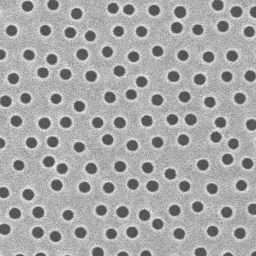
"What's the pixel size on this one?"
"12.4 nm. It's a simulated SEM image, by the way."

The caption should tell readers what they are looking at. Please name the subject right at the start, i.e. a regular array of holes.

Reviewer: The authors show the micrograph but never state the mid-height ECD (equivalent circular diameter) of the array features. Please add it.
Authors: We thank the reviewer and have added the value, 0.143 micrometres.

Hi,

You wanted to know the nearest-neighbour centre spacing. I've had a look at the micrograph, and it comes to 259 nanometres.